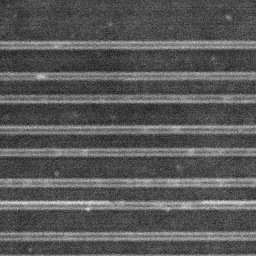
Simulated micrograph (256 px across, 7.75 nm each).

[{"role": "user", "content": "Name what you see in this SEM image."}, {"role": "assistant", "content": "parallel lines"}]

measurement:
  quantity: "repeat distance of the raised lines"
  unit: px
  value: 27.4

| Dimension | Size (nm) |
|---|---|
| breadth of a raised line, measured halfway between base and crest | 54.3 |